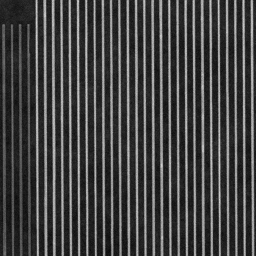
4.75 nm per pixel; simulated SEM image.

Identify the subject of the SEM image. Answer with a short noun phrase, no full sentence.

parallel lines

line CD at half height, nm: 8.9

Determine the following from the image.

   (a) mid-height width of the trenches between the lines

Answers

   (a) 29.7 nanometres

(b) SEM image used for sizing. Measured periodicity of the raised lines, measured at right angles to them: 39.3 nm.